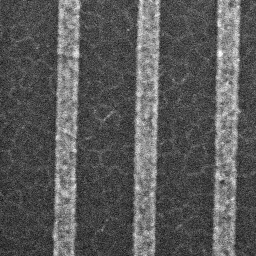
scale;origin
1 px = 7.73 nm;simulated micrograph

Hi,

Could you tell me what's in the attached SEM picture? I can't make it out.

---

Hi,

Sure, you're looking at one or a few lines or trenches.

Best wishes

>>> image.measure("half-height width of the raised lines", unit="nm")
123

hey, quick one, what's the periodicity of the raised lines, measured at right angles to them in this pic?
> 618 nm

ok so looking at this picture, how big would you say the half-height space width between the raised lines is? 63.7 px